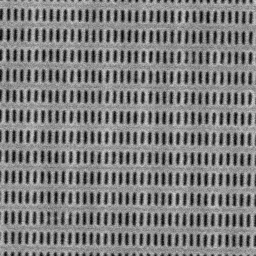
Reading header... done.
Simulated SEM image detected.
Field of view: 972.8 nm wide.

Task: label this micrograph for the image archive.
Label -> a regular array of holes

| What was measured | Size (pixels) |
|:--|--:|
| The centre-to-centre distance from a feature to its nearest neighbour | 7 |